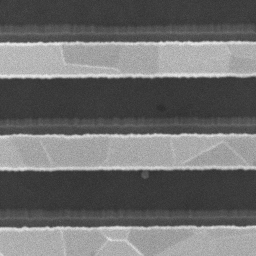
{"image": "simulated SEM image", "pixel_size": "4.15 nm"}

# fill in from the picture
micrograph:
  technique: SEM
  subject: lines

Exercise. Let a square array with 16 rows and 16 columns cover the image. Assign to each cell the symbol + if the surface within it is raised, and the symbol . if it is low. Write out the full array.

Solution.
................
................
++++++++++++++++
++++++++++++++++
++++++++++++++++
................
................
................
++++++++++++++++
++++++++++++++++
++++++++++++++++
................
................
................
++++++++++++++++
++++++++++++++++